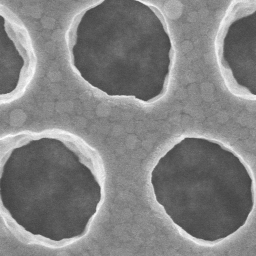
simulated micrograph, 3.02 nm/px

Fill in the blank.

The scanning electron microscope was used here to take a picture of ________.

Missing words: holes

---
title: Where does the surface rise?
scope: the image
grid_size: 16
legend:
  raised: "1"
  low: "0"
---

1111110000111110
0111100000111100
0111000000011100
0011000000011100
0011100000011100
0111110000111110
1111111111111111
1111111111111111
1111111111111111
0000011111100001
0000001111000001
0000001111000000
0000001111000000
1000001111100000
1100011111110001
1111111111111111